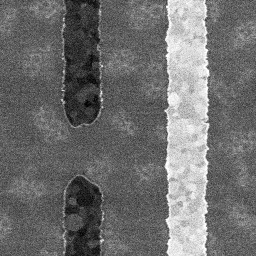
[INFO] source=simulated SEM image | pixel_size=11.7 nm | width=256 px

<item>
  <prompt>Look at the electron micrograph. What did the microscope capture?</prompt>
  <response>one or a few lines or trenches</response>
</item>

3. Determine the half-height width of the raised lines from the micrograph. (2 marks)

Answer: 433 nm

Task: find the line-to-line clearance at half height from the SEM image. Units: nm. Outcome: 792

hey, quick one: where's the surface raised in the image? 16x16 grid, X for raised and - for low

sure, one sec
----XX----XXX---
----XX-----XX---
----XX----XXX---
----XX----XXX---
----XX-----XX---
----XX-----XX---
----XX----XXX---
----XX----XXX---
----------XXX---
----------XXX---
----------XXX---
----XX-----XX---
----XX----XXX---
----XX-----XX---
----XX-----XX---
----XX-----XX---